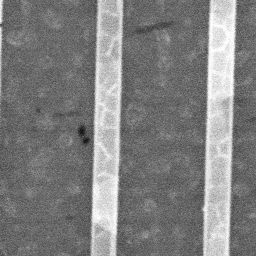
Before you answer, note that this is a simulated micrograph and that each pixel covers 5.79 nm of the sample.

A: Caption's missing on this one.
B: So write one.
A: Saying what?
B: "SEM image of one or a few lines or trenches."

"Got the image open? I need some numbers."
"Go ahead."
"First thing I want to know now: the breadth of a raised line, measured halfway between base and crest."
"134 nanometers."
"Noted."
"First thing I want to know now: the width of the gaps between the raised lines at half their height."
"518 nm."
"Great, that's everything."